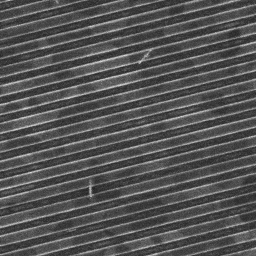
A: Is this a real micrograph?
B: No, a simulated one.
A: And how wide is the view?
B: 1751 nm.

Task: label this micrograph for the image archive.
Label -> parallel lines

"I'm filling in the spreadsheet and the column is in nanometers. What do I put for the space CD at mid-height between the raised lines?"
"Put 58.1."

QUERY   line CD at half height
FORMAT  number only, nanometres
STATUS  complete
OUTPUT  64.7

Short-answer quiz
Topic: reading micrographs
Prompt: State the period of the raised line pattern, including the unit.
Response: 124 nanometres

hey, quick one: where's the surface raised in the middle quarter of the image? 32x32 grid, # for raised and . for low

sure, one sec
....###########.........########
###########........###########..
#######.........#########.......
###........##########..........#
.......##########..........#####
...##########.........##########
#########.........##########....
#####.........##########........
#.........##########.........###
......##########.........#######
..##########.........##########.
########.........##########.....
####.........#########..........
.........#########..........####
.....#########..........########
.#########..........##########..
######.........###########......
##.........###########.........#
.......###########.........#####
...###########........##########
##########........###########...
######........###########.......
##........###########.........##
......##########..........######
..##########..........#########.
########..........#########.....
####.........##########.........
.........##########.........####
.....##########.........########
.##########.........##########..
#######.........##########......
###.........##########.........#